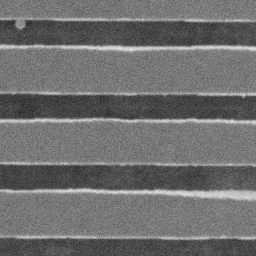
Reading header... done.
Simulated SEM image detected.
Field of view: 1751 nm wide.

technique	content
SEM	lines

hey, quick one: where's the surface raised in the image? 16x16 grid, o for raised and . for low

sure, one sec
oooooooooooooooo
................
................
oooooooooooooooo
oooooooooooooooo
oooooooooooooooo
................
.....ooo........
oooooooooooooooo
oooooooooooooooo
................
................
oooooooooooooooo
oooooooooooooooo
oooooooooooooooo
................